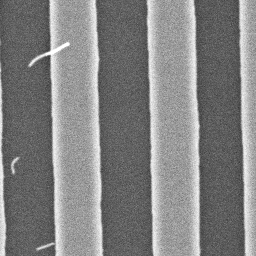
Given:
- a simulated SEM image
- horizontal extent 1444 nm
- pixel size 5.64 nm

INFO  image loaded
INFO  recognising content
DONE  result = lines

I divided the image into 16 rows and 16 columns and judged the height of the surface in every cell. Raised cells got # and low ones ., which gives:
...###...###...#
...###...###...#
...###...###...#
...###...###...#
...###...###...#
...###...###...#
...###...###...#
...###...###...#
...###...###...#
...###...###...#
...###...###...#
...###....##...#
...###....##...#
...###....##...#
...###....##...#
...###....##...#